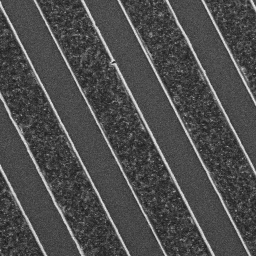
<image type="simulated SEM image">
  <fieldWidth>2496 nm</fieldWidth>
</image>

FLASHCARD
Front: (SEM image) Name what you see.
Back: one or a few lines or trenches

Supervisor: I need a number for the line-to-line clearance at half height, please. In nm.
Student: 313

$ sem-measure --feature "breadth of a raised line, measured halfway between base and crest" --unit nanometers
415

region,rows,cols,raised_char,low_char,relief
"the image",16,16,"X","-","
--XXX---XXX--XXX
X--XXX--XXX--XXX
X--XXX---XXX--XX
XX--XXX--XXX--XX
XX--XXX---XXX--X
XXX--XXX--XXX---
XXX---XX---XXX--
-XXX--XXX--XXX--
-XXX---XXX--XXX-
--XXX--XXX--XXX-
--XXX---XXX--XXX
X--XXX--XXX--XXX
X--XXX---XXX--XX
XX--XXX--XXX--XX
XX--XXX---XXX--X
XXX--XXX--XXX--X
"